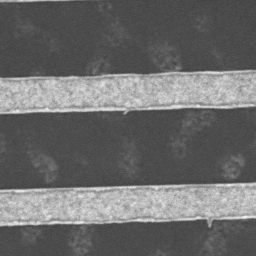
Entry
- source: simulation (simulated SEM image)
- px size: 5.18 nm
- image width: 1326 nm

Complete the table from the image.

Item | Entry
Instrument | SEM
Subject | one or a few lines or trenches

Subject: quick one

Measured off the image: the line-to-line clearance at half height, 398 nanometers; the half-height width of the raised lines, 180 nanometers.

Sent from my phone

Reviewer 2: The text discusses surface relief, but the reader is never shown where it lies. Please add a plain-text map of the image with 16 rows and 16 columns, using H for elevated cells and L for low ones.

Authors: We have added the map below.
LLLLLLLLLLLLLLLL
LLLLLLLLLLLLLLLL
LLLLLLLLLLLLLLLL
LLLLLLLLLLLLLLLL
LLLLLLLLLLLLLHLH
HHHHHHHHHHHHHHHH
HHHHHHHHHHHHHHHH
LLLLLLLLLLLLLLLL
LLLLLLLLLLLLLLLL
LLLLLLLLLLLLLLLL
LLLLLLLLLLLLLLLL
LLLLLLLLLLLLLLLL
HHHHHHHHHHHHHHHH
HHHHHHHHHHHHHHHH
LLLLLLLLLLLLLLLL
LLLLLLLLLLLLLLLL